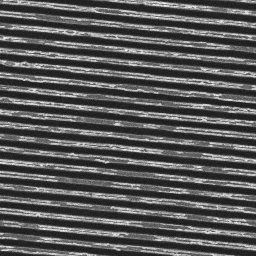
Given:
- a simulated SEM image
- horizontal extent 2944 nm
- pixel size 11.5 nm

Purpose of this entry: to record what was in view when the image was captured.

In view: parallel lines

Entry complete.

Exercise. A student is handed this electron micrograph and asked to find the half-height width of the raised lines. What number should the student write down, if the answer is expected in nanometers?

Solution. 71.6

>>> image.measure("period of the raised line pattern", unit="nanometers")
141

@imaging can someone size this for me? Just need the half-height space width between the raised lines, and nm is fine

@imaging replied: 71.6